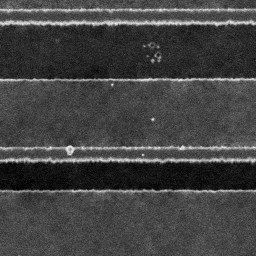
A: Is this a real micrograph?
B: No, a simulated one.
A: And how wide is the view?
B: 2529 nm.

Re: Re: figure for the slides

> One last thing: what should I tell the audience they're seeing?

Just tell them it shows lines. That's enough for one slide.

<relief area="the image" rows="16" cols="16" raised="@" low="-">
@@@@@@@@@@@@@@@@
----------------
----------------
----------------
----------------
@@@@@@@@@@@@@@@@
@@@@@@@@@@@@@@@@
@@@@@@@@@@@@@@@@
@@@@@@@@@@@@@@@@
@@@@@@@@@@@@@@@@
----------------
----------------
@@@@@@@@@@@@@@@@
@@@@@@@@@@@@@@@@
@@@@@@@@@@@@@@@@
@@@@@@@@@@@@@@@@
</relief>